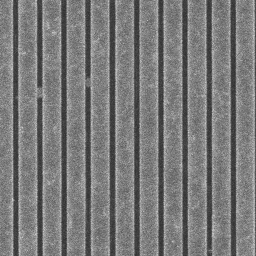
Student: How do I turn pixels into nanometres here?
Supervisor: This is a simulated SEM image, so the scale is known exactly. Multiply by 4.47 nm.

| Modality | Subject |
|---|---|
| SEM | parallel lines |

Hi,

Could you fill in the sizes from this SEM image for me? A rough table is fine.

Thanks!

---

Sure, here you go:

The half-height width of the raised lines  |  79.3 nanometres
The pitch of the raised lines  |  24.2 px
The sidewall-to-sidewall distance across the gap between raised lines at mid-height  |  30.7 nanometres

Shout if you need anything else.